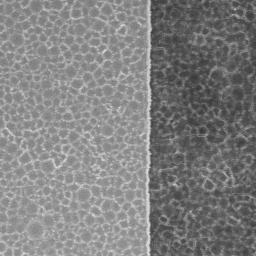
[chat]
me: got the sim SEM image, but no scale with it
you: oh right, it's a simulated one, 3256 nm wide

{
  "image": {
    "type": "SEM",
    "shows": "one or a few lines or trenches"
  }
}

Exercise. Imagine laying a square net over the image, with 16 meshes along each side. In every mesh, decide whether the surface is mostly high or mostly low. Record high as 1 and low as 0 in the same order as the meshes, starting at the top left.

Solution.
1111111110000000
1111111110000000
1111111110000000
1111111110000000
1111111110000000
1111111110000000
1111111110000000
1111111110000000
1111111110000000
1111111110000000
1111111110000000
1111111110000000
1111111110000000
1111111110000000
1111111110000000
1111111110000000